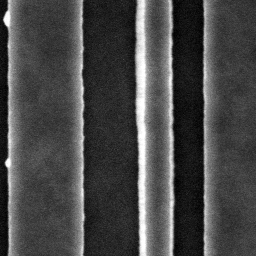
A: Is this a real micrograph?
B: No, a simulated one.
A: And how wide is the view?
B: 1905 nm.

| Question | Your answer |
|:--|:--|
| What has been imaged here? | lines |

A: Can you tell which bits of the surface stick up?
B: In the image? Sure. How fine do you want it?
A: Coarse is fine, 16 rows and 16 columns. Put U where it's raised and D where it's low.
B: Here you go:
DUUUUDDDDUUDDUUU
UUUUUDDDDUUDDUUU
DUUUUDDDDUUDDUUU
DUUUUDDDDUUDDUUU
DUUUUDDDDUUDDUUU
DUUUUDDDDUUDDUUU
DUUUUDDDDUUDDUUU
DUUUUDDDDUUDDUUU
DUUUUDDDDUUDDUUU
DUUUUDDDDUUDDUUU
UUUUUDDDDUUDDUUU
DUUUUDDDDUUDDUUU
DUUUUDDDDUUDDUUU
DUUUUDDDDUUDDUUU
DUUUUDDDDUUDDUUU
DUUUUDDDDUUDDUUU